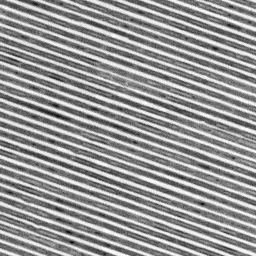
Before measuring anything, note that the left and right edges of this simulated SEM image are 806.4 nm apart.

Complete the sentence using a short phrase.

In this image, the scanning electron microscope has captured parallel lines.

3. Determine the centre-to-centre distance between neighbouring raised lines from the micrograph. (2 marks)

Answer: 8.86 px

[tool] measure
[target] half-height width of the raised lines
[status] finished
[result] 8.2 nanometres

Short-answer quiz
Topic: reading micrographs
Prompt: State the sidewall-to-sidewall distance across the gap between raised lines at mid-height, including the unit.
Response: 18.9 nm